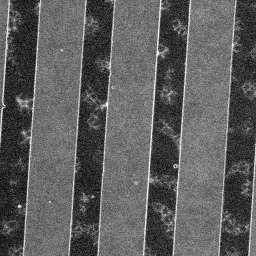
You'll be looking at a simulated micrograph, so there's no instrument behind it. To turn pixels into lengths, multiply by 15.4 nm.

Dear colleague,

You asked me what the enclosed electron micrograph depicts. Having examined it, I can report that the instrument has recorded one or a few lines or trenches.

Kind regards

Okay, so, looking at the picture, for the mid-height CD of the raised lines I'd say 0.456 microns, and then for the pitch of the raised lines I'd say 1150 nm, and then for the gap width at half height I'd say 690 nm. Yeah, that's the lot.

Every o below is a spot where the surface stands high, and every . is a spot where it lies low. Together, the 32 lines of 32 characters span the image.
.oooo......ooo......oooo.....ooo
.oooo......ooo......oooo.....ooo
.oooo......ooo......oooo.....ooo
.oooo......ooo......oooo.....ooo
.oooo.....oooo......ooo......ooo
.oooo.....oooo......ooo......ooo
.oooo.....oooo......ooo......ooo
.oooo.....oooo......ooo......ooo
.ooo......oooo......ooo......ooo
.ooo......oooo.....oooo......ooo
.ooo......oooo.....oooo......ooo
oooo......oooo.....oooo......ooo
oo.o......ooo......oooo......ooo
oooo......ooo......oooo......ooo
oooo......ooo......oooo......ooo
oooo......ooo......oooo.....oooo
oooo......ooo......oooo.....oooo
oooo......ooo......oooo.....oooo
oooo......ooo......oooo.....oooo
oooo.....oooo......ooo......oooo
oooo.....oooo......ooo......oooo
oooo.....oooo......ooo......oooo
oooo.....oooo......ooo......oooo
ooo......oooo......ooo......oooo
ooo......oooo.....oooo......oooo
ooo......oooo.....oooo......oooo
ooo......oooo.....oooo......ooo.
ooo......ooo......oooo......ooo.
ooo......ooo......oooo......ooo.
ooo......ooo......oooo.....oooo.
ooo......ooo......oooo.....oooo.
ooo......ooo......oooo.....oooo.